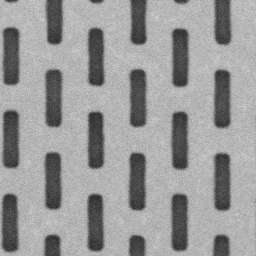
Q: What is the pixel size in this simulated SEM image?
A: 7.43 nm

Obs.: a regular array of holes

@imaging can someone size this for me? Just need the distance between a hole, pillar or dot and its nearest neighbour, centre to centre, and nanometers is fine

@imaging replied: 435